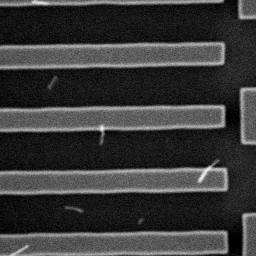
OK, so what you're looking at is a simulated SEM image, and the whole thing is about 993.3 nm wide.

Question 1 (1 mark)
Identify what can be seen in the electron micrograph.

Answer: groups of lines, slits or small figures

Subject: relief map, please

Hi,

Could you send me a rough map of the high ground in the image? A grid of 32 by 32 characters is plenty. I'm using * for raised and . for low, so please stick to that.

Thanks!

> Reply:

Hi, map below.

************..***.............**
..............................**
................................
................................
................................
................************....
****************************....
****************************....
*******.........................
................................
................................
..............................**
..............................**
......**..******************..**
****************************..**
****************************..**
..............................**
..............................**
................................
................................
................................
****************************....
****************************....
****************************....
................................
................................
................................
..............................**
...............................*
****************************...*
****************************..**
****************************..**